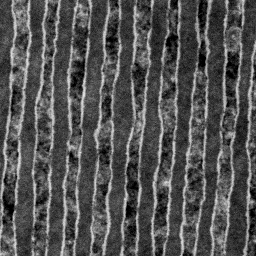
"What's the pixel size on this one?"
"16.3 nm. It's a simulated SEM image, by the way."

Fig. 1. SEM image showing parallel lines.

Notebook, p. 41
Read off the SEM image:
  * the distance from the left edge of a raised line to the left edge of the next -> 493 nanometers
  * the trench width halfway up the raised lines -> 232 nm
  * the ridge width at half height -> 264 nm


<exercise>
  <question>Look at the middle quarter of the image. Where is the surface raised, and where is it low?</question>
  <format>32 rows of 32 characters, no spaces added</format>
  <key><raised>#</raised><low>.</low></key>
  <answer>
##...#####....###....####...####
#.....###.....###....####...####
#....#####...####....###....####
#....#####...####....###....####
#....#####...####....###....####
#....#####..#####....###....####
#....####...#####....###....####
#....####...#####...####....####
#....####...#####...####....####
#....####...#####...####....####
#....####...#####...####....####
#....####...######..####....####
#....####...######..####....####
#...#####...######..####....####
#...#####...######..####....####
##..#####...#####...#####...####
##..####....#####...#####...###.
##...###....#####...####....####
#....###....#####..#####...#####
#...####....####...#####...#####
#...####....####...#####...####.
#...####....####...#####....###.
#...#####...####...#####....###.
#...#####...####...#####...####.
#...#####...####...#####...####.
#...####....####..######...####.
#...####....####..#####....####.
#...####....###....####....####.
...#####....###....####....###..
...#####....###....####....####.
...#####...####....###.....###..
...#####...####....####....###..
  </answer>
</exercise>